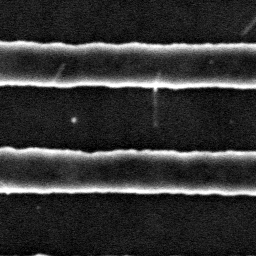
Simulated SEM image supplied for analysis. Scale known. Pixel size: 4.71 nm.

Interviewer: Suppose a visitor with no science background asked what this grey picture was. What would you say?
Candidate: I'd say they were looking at lines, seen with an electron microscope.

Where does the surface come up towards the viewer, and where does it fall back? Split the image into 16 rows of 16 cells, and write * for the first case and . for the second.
................
................
................
****************
****************
................
................
................
................
*****..****...*.
****************
****************
................
................
................
................